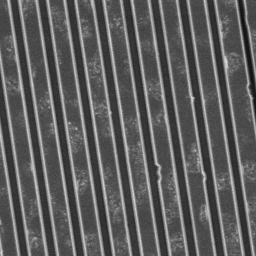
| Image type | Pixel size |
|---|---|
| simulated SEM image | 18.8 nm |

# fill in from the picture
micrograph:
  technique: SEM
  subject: parallel lines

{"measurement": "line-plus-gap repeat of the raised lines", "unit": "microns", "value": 0.523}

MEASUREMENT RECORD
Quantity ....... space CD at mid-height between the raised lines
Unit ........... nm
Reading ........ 177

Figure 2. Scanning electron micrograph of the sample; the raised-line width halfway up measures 334 nm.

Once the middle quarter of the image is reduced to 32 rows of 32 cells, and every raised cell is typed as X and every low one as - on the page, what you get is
XXX--XXXXX--XXXXX--XXXXX--XXXXX-
XXX---XXXX---XXXX---XXXX--XXXXX-
XXX---XXXX---XXXX---XXXX---XXXX-
XXX---XXXX---XXXX---XXXX---XXXX-
XXX---XXXX---XXXX---XXXX---XXXX-
XXX---XXXX---XXXXX--XXXXX--XXXXX
XXXX--XXXXX--XXXXX--XXXXX--XXXXX
XXXX--XXXXX--XXXXX---XXXX--XXXXX
XXXX---XXXX---XXXX---XXXX--XXXXX
XXXX---XXXX---XXXX---XXXX---XXXX
XXXX---XXXX---XXXX---XXXX---XXXX
XXXX---XXXX---XXXX---XXXX---XXXX
XXXX---XXXXX--XXXXX--XXXXX--XXXX
XXXXX--XXXXX--XXXXX--XXXXX--XXXX
XXXXX--XXXXX---XXXX---XXXX--XXXX
-XXXX---XXXX---XXXX---XXXX---XXX
-XXXX---XXXX---XXXX---XXXX---XXX
-XXXX---XXXX---XXXX---XXXX---XXX
-XXXX---XXXX---XXXX---XXXX---XXX
-XXXXX--XXXXX--XXXXX--XXXXX--XXX
-XXXXX--XXXXX--XXXXX--XXXXX--XXX
-XXXXX---XXXX---XXXX---XXXX--XXX
--XXXX---XXXX---XXXX---XXXX---XX
--XXXX---XXXX---XXXX---XXXX---XX
--XXXX---XXXX---XXXX---XXXX---XX
--XXXX---XXXX---XXXX----XXXX--XX
--XXXXX--XXXXX--XXXXX---XXXX--XX
--XXXXX--XXXXX--XXXXX---XXXX--XX
---XXXX---XXXX---XXXX---XXXX--XX
---XXXX---XXXX---XXXX---XXXX---X
---XXXX---XXXX---XXXX---XXXX---X
---XXXX---XXXX---XXXX---XXXX---X